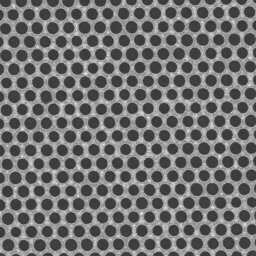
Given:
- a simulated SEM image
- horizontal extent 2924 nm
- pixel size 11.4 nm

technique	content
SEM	a regular array of holes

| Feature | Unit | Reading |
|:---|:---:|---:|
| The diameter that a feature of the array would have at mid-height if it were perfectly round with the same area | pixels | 11.7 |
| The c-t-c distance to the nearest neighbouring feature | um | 0.175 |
